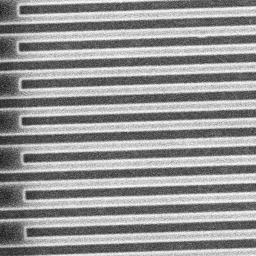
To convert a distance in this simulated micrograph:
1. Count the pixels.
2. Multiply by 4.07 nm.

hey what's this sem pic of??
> parallel lines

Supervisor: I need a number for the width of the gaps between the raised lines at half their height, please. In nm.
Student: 41.7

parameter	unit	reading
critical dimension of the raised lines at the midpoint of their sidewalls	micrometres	0.035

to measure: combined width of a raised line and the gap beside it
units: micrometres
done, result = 0.0754